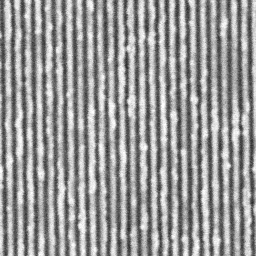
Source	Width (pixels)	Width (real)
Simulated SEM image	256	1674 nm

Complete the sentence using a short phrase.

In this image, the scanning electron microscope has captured parallel lines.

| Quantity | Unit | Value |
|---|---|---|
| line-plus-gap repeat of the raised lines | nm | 67.3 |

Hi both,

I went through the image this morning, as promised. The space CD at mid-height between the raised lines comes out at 33.5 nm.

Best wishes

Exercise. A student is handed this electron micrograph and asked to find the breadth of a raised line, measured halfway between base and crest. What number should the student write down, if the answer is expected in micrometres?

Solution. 0.0335